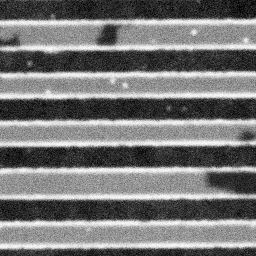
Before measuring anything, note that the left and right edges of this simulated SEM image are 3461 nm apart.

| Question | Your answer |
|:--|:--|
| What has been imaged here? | lines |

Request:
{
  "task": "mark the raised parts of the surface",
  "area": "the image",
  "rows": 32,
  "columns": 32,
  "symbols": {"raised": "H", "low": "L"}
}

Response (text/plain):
LLLLLLLLLLLLLLLLLLLLLLLLLLLLLLLL
LLLLLLLLLLLLLLLLLLLLLLLLLLLLLLLL
LLLLLLLLLLLLLLLLLLLLLLLLLLLLHLLL
HHHHHHHHHHHHHHHHHHHHHHHHHHHHHHHH
HHHHHHHHHHHHHHHHHHHHHHHHHHHHHHHH
HHHHHHHHHHHHHHHHHHHHHHHHHHHHHHHH
LLLLLLLLLLLLLLLLLLLLLLLLLLLLLLLL
LLLLLLLLLLLLLLLLLLLLLLLLLLLLLLLL
LLLLLLLLLLLLLLLLLLLLLLLLLLLLLLLL
HHHHHHHHHHHHHHHHHHHHHHHHHHHHHHHH
HHHHHHHHHHHHHHHHHHHHHHHHHHHHHHHH
HHHHHHHHHHHHHHHHHHHHHHHHHHHHHHHH
LLLLLLLLLLLLLLLLLLLLLLLLLLLLLLLL
LLLLLLLLLLLLLLLLLLLLLLLLLLLLLLLL
LLLLLLLLLLLLLLLLLLLLLLLLLLLLLLLL
HHHHHHHHHHHHHHHHHHHHHHHHHHHHHHHH
HHHHHHHHHHHHHHHHHHHHHHHHHHHHHHHH
HHHHHHHHHHHHHHHHHHHHHHHHHHHHHHHH
LLLLLLLLLLLLLLLLLLLLLLLLLLLLLLLL
LLLLLLLLLLLLLLLLLLLLLLLLLLLLLLLL
LLLLLLLLLLLLLLLLLLLLLLLLLLLLLLLL
HHHHHHHHHHHHHHHHHHHHHHHHHHHHHHHH
HHHHHHHHHHHHHHHHHHHHHHHHHHHHHHHH
HHHHHHHHHHHHHHHHHHHHHHHHHHHHHHHH
HHHHHHHHHHHHHHHHHHHHHHHHHHHHHHHH
LLLLLLLLLLLLLLLLLLLLLLLLLLLLLLLL
LLLLLLLLLLLLLLLLLLLLLLLLLLLLLLLL
LLLLLLLLLLLLLLLLLLLLLLLLLLLLLLLL
HHHHHHHHHHHHHHHHHHHHHHHHHHHHHHHH
HHHHHHHHHHHHHHHHHHHHHHHHHHHHHHHH
HHHHHHHHHHHHHHHHHHHHHHHHHHHHHHHH
LLLLLLLLLLLLLLLLLLLLLLLLLLLLLLLL